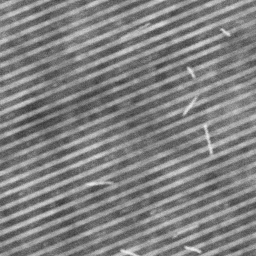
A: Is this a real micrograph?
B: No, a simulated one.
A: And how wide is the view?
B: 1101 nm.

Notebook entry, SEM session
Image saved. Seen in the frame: parallel lines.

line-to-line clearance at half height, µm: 0.0338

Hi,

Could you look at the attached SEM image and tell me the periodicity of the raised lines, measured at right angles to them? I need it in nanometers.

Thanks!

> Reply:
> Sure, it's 47.4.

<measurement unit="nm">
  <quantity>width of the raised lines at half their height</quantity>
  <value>14.9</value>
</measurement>